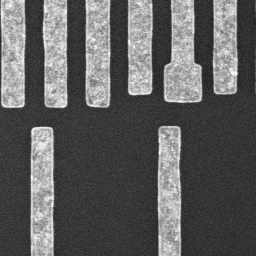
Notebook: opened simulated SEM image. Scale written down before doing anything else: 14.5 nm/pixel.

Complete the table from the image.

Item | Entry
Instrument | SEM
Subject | wiring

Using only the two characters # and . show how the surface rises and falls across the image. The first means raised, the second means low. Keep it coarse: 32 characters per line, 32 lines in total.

###...##...###..###...##...###..
###...##...###..###...##...###..
###...##...###..###...##...###..
###..###...###..###...##...###..
###..###...###..###...##...###..
###...##...###..###...##...###..
###...##...###..###...##...###..
###...##...###..###..###...###..
###...##...###..###..####..###..
###...##...###..###..####..###..
###...##...###..###..####..###..
###...##...###..###..####..##...
###...##...###.......####.......
................................
................................
................................
....###.............##..........
....###.............##..........
....###.............##..........
....###.............##..........
....###.............##..........
....###.............##..........
....###.............##..........
....###.............##..........
....###.............##..........
....###.............##..........
....##..............##..........
....##..............##..........
....###.............##..........
....###.............##..........
....###.............##..........
....###.............##..........